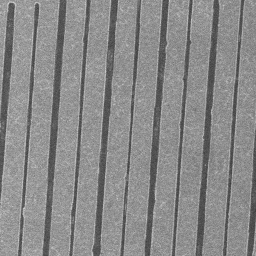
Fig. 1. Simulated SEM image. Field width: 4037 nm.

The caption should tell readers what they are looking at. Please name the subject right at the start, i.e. parallel lines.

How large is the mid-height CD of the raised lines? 311 nm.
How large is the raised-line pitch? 0.401 µm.